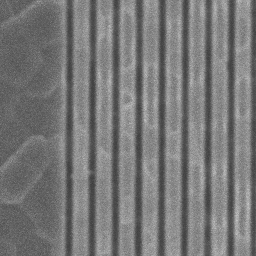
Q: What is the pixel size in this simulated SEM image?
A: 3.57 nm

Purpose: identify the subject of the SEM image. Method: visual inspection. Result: parallel lines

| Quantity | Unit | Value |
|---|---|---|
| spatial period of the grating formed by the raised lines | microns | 0.0824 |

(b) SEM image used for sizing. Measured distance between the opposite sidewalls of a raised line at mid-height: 53.5 nm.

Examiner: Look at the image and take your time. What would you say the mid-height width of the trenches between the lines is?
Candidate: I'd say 26.7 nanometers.